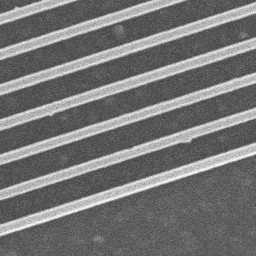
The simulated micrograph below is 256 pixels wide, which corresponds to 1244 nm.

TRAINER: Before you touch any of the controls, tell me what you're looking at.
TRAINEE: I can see parallel lines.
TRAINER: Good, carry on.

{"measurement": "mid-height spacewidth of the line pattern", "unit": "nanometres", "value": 122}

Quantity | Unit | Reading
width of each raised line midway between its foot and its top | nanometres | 41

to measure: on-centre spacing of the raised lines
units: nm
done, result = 163